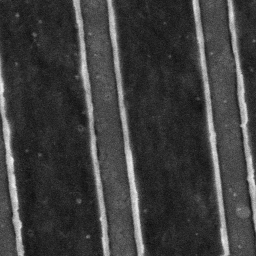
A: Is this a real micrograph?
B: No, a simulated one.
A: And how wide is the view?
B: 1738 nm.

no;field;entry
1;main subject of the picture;one or a few lines or trenches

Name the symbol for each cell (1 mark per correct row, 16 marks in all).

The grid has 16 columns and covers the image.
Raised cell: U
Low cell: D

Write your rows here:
UUUUUDDUUUUUDDUU
UUUUUDDUUUUUDDDU
UUUUUDDUUUUUUDDU
UUUUUDDUUUUUUDDU
UUUUUDDUUUUUUDDU
UUUUUUDUUUUUUDDU
UUUUUUDDUUUUUDDU
UUUUUUDDUUUUUDDU
UUUUUUDDUUUUUDDU
UUUUUUDDUUUUUDDU
DUUUUUDDUUUUUUDD
DUUUUUDDUUUUUUDD
DUUUUUDDUUUUUUDD
DUUUUUDDUUUUUUDD
DUUUUUUDDUUUUUDD
DUUUUUUDDUUUUUDD